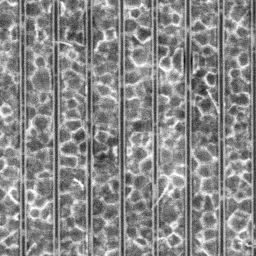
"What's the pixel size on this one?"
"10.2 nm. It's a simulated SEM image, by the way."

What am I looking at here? parallel lines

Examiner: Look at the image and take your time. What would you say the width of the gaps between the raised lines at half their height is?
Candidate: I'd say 289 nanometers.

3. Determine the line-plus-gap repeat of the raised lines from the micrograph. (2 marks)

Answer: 336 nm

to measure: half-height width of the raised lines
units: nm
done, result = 52.1